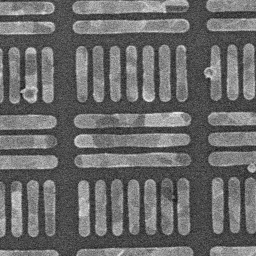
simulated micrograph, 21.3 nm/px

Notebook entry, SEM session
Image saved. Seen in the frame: groups of lines, slits or small figures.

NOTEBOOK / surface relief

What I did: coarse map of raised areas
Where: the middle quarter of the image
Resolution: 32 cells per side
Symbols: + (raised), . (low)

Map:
...+++..++..++..++..++..++..++..
...+++..++..++..++..++..++..++..
...+++.+++..++..++..++..++..++..
...+++.+++..++..++..++..++..++..
...+++..++..++..++..++..++..++..
...+++..++..++..++..++..++..++..
...+++..++..++..++..++..++..+++.
...+++..++..++..++..++..+++.+++.
...+++..++..++..++..++..+++.+++.
................................
................................
................................
.......................++++++++.
...++++++++++++++++++++++++++++.
...++++++++++++++++++++++++++++.
...++++++++++++++++....++.......
................................
................................
...++++++++++++++++++++++++++++.
...++++++++++++++++++++++++++++.
...++++++++++.......++++........
................................
.....................+++++++....
...+++++++++++++++++++++++++++++
...++++++++++++++++++++++++++++.
...++++++++++...................
................................
................................
................................
....++..++..++..++...+..+++..++.
....++..++..++..+++.+++.+++..++.
....++..++..++..+++.+++.+++..++.